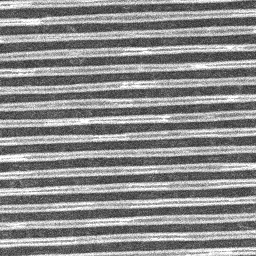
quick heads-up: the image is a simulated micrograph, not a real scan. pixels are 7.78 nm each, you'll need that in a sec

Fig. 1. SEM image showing parallel lines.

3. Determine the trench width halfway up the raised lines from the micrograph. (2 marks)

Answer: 0.0855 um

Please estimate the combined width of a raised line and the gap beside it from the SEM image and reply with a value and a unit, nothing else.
132 nm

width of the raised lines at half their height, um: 0.0495